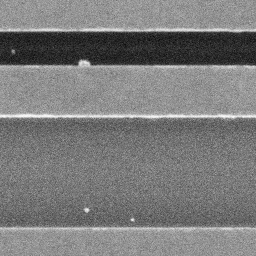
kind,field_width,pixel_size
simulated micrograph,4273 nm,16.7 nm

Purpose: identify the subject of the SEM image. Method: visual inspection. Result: lines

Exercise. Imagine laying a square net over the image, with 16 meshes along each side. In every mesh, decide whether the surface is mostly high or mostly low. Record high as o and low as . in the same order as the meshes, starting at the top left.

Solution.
oooooooooooooooo
oooooooooooooooo
................
................
oooooooooooooooo
oooooooooooooooo
oooooooooooooooo
................
................
................
................
................
................
................
oooooooooooooooo
oooooooooooooooo